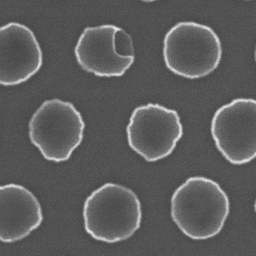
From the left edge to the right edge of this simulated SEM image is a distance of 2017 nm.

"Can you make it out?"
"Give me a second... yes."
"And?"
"raised bodies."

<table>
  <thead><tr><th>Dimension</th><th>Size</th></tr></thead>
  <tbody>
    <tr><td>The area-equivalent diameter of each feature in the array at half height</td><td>56.1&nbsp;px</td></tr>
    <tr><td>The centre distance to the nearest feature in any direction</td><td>704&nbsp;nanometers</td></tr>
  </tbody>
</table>